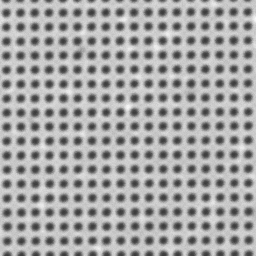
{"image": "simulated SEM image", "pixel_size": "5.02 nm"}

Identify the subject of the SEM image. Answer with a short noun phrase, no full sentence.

a regular array of holes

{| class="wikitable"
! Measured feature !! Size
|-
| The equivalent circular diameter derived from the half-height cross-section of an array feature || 45.3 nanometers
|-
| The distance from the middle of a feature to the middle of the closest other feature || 70.2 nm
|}